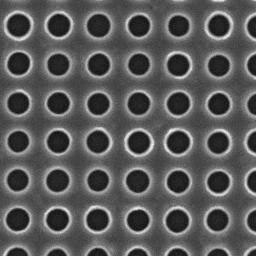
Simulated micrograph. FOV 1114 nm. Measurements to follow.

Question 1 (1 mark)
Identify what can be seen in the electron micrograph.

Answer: a regular array of holes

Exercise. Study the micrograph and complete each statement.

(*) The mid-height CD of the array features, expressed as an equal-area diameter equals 0.0984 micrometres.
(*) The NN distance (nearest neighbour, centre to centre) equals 168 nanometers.